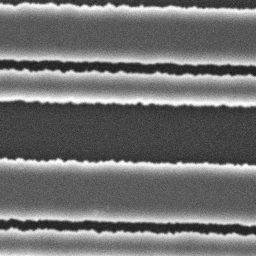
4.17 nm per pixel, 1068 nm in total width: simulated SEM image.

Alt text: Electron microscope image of lines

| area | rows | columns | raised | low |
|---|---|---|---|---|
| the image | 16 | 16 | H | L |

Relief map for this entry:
HHHHHHHHHHHLLLLL
HHHHHHHHHHHHHHHH
HHHHHHHHHHHHHHHH
HHHHHHHHHHHHHHHH
HHHHHHHHHHHHHHHH
HHHHHHHHHHHHHHHH
LLLLLLLLLLLLHHHH
LLLLLLLLLLLLLLLL
LLLLLLLLLLLLLLLL
LLLLLLLLLLLLLLLL
HHHHHHHHHHHHHHHH
HHHHHHHHHHHHHHHH
HHHHHHHHHHHHHHHH
HHHHHHHHHHHHHHHH
HHHHHHHHHHHHHHHH
HHHHHHHHHHHHHHHH